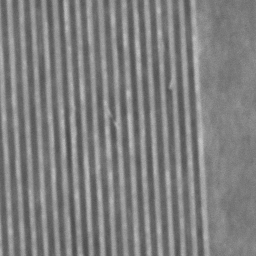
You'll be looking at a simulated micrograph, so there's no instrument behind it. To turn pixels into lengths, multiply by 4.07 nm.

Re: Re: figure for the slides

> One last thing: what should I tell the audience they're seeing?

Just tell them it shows parallel lines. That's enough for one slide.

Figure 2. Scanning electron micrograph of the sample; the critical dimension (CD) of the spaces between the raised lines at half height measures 27.5 nm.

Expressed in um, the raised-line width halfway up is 0.0193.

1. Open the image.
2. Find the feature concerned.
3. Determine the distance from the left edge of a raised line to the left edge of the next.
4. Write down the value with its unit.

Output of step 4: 46.6 nm